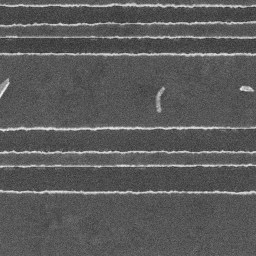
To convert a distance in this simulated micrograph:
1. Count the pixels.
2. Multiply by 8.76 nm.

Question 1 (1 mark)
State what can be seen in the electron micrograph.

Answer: lines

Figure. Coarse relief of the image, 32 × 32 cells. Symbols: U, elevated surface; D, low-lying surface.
UUUUUUUUUUUUUUUUUUUUUUUUUUUUUUUU
DDDDDDDDDDDDDDDDDDDDDDDDDDDDDDDD
DDDDDDDDDDDDDDDDDDDDDDDDDDDDDDDD
UUUUUUUUUUUUUUUUUUUUUUUUUUUUUUUU
UUUUUUUUUUUUUUUUUUUUUUUUUUUUUUUU
DDDDDDDDDDDDDDDDDDDDDDDDDDDDDDDD
DDDDDDDDDDDDDDDDDDDDDDDDDDDDDDDD
UUUUUUUUUUUUUUUUUUUUUUUUUUUUUUUU
UUUUUUUUUUUUUUUUUUUUUUUUUUUUUUUU
UUUUUUUUUUUUUUUUUUUUUUUUUUUUUUUU
UUUUUUUUUUUUUUUUUUUUUUUUUUUUUUUU
UUUUUUUUUUUUUUUUUUUUUUUUUUUUUUUU
UUUUUUUUUUUUUUUUUUUUUUUUUUUUUUUU
UUUUUUUUUUUUUUUUUUUUUUUUUUUUUUUU
UUUUUUUUUUUUUUUUUUUUUUUUUUUUUUUU
UUUUUUUUUUUUUUUUUUUUUUUUUUUUUUUU
DDDDDDDDDDDDDDDDDDDDDDDDDDDDDDDD
DDDDDDDDDDDDDDDDDDDDDDDDDDDDDDDD
DDDDDDDDDDDDDDDDDDDDDDDDDDDDDDDD
UUUUUUUUUUUUUUUUUUUUUUUUUUUUUUUU
UUUUUUUUUUUUUUUUUUUUUUUUUUUUUUUU
DDDDDDDDDDDDDDDDDDDDDDDDDDDDDDDD
DDDDDDDDDDDDDDDDDDDDDDDDDDDDDDDD
DDDDDDDDDDDDDDDDDDDDDDDDDDDDDDDD
UUUUUUUUUUUUUUUUUUUUUUUUUUUUUUUU
UUUUUUUUUUUUUUUUUUUUUUUUUUUUUUUU
UUUUUUUUUUUUUUUUUUUUUUUUUUUUUUUU
UUUUUUUUUUUUUUUUUUUUUUUUUUUUUUUU
UUUUUUUUUUUUUUUUUUUUUUUUUUUUUUUU
UUUUUUUUUUUUUUUUUUUUUUUUUUUUUUUU
UUUUUUUUUUUUUUUUUUUUUUUUUUUUUUUU
UUUUUUUUUUUUUUUUUUUUUUUUUUUUUUUU